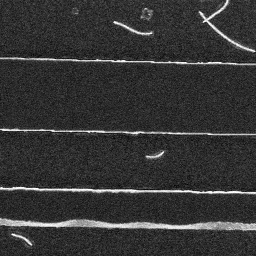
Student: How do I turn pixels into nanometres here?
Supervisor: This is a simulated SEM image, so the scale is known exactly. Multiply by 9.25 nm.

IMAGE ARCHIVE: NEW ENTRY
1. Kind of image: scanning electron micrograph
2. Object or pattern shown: lines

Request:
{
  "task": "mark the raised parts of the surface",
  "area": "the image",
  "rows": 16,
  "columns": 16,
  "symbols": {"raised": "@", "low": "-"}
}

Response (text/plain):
----------------
----------------
----------------
----------------
@@@@@@@@@@@@@@@@
@@@@@@@@@@@@@@@@
@@@@@@@@@@@@@@@@
@@@@@@@@@@@@@@@@
----------------
----------------
----------------
----------------
@@@@@@@@@@@@@@@@
@@@@@@@@@@@@@@@@
----------------
----------------